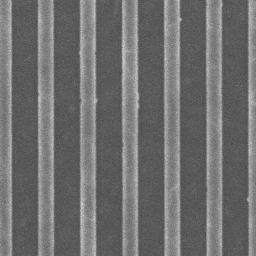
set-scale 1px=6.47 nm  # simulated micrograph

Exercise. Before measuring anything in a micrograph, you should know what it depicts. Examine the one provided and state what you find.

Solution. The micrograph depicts parallel lines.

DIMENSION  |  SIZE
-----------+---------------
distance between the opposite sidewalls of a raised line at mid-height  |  98.6 nm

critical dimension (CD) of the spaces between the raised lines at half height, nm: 174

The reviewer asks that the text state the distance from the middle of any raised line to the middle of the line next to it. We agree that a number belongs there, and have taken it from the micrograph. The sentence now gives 273 nanometers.